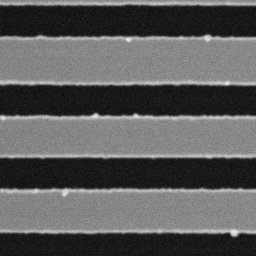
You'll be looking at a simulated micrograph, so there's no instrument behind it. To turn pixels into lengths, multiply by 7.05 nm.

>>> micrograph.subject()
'lines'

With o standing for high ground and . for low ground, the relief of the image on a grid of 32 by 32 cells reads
oooooooooooooooooooooooooooooooo
................................
................................
................................
.........................o......
oooooooooooooooooooooooooooooooo
oooooooooooooooooooooooooooooooo
oooooooooooooooooooooooooooooooo
oooooooooooooooooooooooooooooooo
oooooooooooooooooooooooooooooooo
o..oo.ooooooooooo.oo.oo..ooooooo
................................
................................
................................
o.o.ooo...oooo.oooo.o..o.o.oo.o.
oooooooooooooooooooooooooooooooo
oooooooooooooooooooooooooooooooo
oooooooooooooooooooooooooooooooo
oooooooooooooooooooooooooooooooo
oooooooooooooooooooooooooooooooo
................................
................................
................................
................................
oooooooooooooooooooooooooooooooo
oooooooooooooooooooooooooooooooo
oooooooooooooooooooooooooooooooo
oooooooooooooooooooooooooooooooo
oooooooooooooooooooooooooooooooo
................................
................................
................................